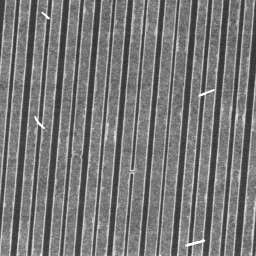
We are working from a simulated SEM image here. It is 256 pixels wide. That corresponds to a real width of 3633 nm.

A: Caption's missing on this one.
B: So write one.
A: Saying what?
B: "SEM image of parallel lines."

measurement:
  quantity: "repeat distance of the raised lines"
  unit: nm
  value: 227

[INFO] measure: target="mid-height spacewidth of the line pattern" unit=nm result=81.3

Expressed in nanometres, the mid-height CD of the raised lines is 142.